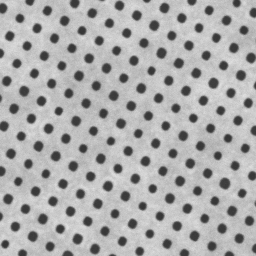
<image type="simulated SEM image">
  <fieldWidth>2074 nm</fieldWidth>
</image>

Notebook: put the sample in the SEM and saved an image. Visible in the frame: a regular array of holes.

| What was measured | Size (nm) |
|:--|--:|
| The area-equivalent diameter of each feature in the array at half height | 78.6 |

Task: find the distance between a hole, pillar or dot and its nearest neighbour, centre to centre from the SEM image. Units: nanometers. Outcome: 162